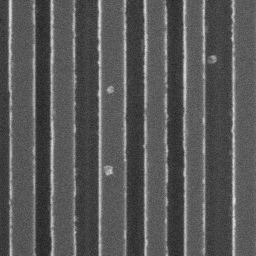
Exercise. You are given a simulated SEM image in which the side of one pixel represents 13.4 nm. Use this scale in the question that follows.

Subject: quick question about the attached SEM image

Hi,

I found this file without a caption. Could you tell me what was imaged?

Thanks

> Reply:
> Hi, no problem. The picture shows lines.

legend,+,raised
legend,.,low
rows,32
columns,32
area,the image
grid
.+++..+++...++++..+++..+++...+++
.+++...++...++++..+++..+++...+++
.+++...++...++++..+++..+++...+++
.+++..+++...++++..+++..+++...+++
.+++...++...++++..+++..+++...+++
.+++...++...++++..+++..+++...+++
.+++...++...++++..+++..+++...+++
.+++...++...++++..+++..+++...+++
.+++..+++...++++..+++..+++...+++
.+++..+++...++++..+++..+++...+++
.+++..+++...++++..+++..+++...+++
.+++..+++...++++..+++..+++...+++
.+++..+++...++++..+++..+++...+++
.+++..+++...++++..+++..+++...+++
.+++...++...++++..+++..+++...+++
.+++...++...++++..+++..+++...+++
.+++...++...++++..+++..+++...+++
.+++...++...++++..+++..+++...+++
.+++...++...++++..+++..+++...+++
.+++...++...++++..+++..+++...+++
.+++...++...++++..+++..+++...+++
.+++..+++...++++..+++..+++...+++
.+++...++...++++..+++..+++...+++
.+++...++...++++..+++..+++...+++
.+++...++...++++..+++..+++...+++
.+++..+++...++++..+++..+++...+++
.+++..+++...++++..+++..+++...+++
.+++...++...++++..+++..+++...+++
.+++...++...++++..+++..+++...+++
.+++...++...++++..+++..+++...+++
.+++...++...++++..+++..+++...+++
.+++...++...++++..+++..+++...+++